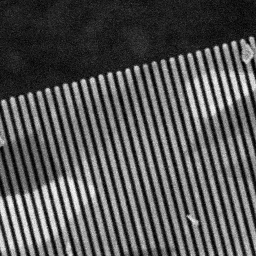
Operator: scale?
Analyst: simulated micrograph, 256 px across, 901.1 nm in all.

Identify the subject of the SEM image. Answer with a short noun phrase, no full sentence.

parallel lines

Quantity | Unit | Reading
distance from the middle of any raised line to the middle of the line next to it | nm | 32.1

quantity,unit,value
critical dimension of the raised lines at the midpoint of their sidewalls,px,4.74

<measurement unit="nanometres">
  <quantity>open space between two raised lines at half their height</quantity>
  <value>17.1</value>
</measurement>